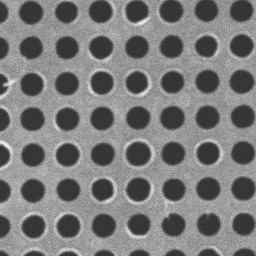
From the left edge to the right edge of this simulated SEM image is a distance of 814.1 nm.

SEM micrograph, a regular array of holes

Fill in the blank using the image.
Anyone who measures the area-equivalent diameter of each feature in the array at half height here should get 76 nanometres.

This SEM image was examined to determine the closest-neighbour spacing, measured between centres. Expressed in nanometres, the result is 110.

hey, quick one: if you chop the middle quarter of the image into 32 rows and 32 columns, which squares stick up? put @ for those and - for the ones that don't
@@@@@@@@@@@@@@@@@@@@@@@@@@@@@@@@
@@@@@@@@@@@@@@@@@@@@@@@@@@@@@@@@
--@@@@@----@@@@@@---@@@@@----@@@
---@@@@-----@@@------@@@------@@
----@@------@@@------@@@------@@
----@@------@@@------@@@------@@
---@@@@-----@@@@----@@@@@----@@@
---@@@@@@-@@@@@@@-@@@@@@@@--@@@@
@@@@@@@@@@@@@@@@@@@@@@@@@@@@@@@@
@@@@@@@@@@@@@@@@@@@@@@@@@@@@@@@@
@@@@@@@@@-@@@@@@@@@@@@@@@@@-@@@@
---@@@@-----@@@@-----@@@@-----@@
----@@@-----@@@@------@@------@@
----@@@------@@-------@@------@@
----@@@-----@@@@-----@@@------@@
---@@@@-----@@@@-----@@@@----@@@
--@@@@@@--@@@@@@@@@@@@@@@@--@@@@
@@@@@@@@@@@@@@@@@@@@@@@@@@@@@@@@
@@@@@@@@@@@@@@@@@@@@@@@@@@@@@@@@
@@@@@@@@@@@@@@@@@@-@@@@@@@@-@@@@
---@@@@@----@@@@-----@@@@----@@@
----@@@------@@@------@@------@@
----@@@------@@-------@@------@@
----@@@-----@@@@------@@------@@
---@@@@-----@@@@-----@@@@----@@@
--@@@@@@@-@@@@@@@@-@@@@@@@@@@@@@
@@@@@@@@@@@@@@@@@@@@@@@@@@@@@@@@
@@@@@@@@@@@@@@@@@@@@@@@@@@@@@@@@
@@@@@@@@@-@@@@@@@@--@@@@@@@@@@@@
---@@@@-----@@@@-----@@@@-----@@
----@@@-----@@@@------@@@-----@@
----@@@------@@-------@@------@@